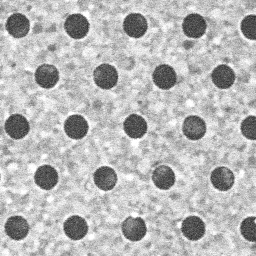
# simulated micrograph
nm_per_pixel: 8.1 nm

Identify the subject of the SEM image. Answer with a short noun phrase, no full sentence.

a regular array of holes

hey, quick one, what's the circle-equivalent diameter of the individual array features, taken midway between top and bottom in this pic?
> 213 nanometres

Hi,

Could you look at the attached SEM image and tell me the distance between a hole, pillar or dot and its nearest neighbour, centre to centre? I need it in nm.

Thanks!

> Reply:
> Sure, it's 470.